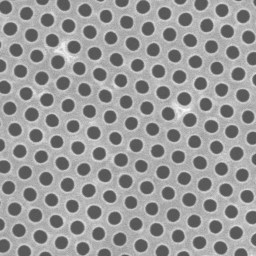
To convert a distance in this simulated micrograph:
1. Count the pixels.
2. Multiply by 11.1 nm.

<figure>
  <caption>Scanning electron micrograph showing a regular array of holes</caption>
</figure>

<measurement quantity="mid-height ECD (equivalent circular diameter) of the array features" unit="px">13.4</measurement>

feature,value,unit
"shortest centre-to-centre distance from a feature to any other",241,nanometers